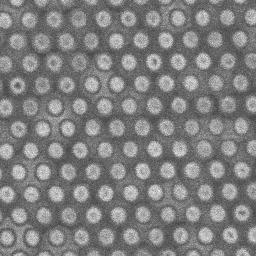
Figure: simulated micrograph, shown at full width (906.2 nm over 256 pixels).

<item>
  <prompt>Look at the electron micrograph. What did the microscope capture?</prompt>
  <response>a regular array of raised bodies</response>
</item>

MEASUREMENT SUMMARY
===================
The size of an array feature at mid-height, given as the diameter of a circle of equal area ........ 0.0512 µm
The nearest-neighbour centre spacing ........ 86.9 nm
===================